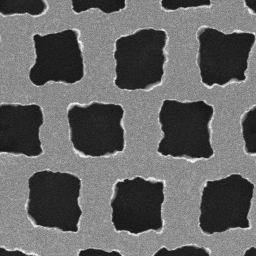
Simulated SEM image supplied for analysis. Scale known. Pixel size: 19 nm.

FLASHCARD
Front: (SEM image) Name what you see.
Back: holes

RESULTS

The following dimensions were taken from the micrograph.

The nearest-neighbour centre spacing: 1570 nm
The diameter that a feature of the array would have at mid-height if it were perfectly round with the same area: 1090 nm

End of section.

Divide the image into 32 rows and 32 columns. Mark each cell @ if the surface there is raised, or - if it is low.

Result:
------@@@-------@@@@------@@@@@-
-----@@@@@@@@-@@@@@@@@@@@@@@@@@@
@@@@@@@@@@@@@@@@@@@@@@@@@@@@@@@@
@@@@@@@@@@@@@@@@@@-@@@@@@@@@@@@@
@@@@------@@@@@@-----@@@@-------
@@@@------@@@@-------@@@@-------
@@@@------@@@@------@@@@@------@
@@@@------@@@@-------@@@@------@
@@@@------@@@@------@@@@@------@
@@@@------@@@@@-----@@@@@------@
@@@@--@@@@@@@@-----@@@@@@@--@@@@
@@@@@@@@@@@@@@@@@@@@@@@@@@@@@@@@
@@@@@@@@@@@@@@@@@@@@@-@@@@@@@@@@
-----@@@@------@@@@@-------@@@@@
-----@@@-------@@@@@-------@@@--
-----@@@@------@@@@@------@@@@--
-----@@@@------@@@@@------@@@@--
-----@@@@-------@@@@------@@@@--
-----@@@@------@@@@@------@@@@@-
@@@--@@@@@@--@@@@@@@@@----@@@@@@
@@@@@@@@@@@@@@@@@@@@@@@@@@@@@@@@
@@@@@--@@@@@@@@@@@@@@@@@@@@@@@@@
@@@@------@@@@@@--@@@@@@@@@----@
@@@@------@@@@------@@@@@-------
@@@@------@@@@------@@@@@-------
@@@-------@@@@------@@@@@------@
@@@-------@@@@------@@@@@------@
@@@@------@@@@------@@@@@------@
@@@@@@@---@@@@------@@@@@----@-@
@@@@@@@@@@@@@@@@@@@@@@@@@@@@@@@@
@@@@@@@@@@@@@@@@@@@@@@@@@@@@@@@@
---@@@@@@@-----@@@@@------@@@@@-